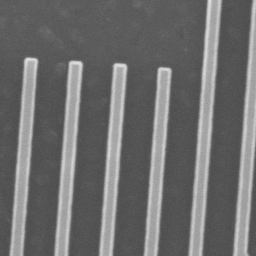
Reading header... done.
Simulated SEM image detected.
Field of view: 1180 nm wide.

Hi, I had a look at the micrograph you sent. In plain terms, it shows parallel lines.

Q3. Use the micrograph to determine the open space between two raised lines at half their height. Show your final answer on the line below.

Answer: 155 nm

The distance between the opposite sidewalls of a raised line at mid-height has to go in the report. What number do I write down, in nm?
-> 48.9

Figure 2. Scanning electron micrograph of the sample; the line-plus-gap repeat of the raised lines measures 206 nm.